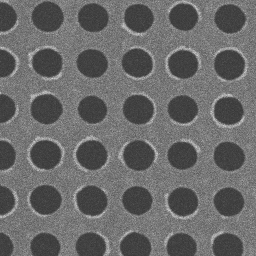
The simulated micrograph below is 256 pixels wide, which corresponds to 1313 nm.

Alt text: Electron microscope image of a regular array of holes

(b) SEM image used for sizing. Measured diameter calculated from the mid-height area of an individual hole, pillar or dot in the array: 152 nanometres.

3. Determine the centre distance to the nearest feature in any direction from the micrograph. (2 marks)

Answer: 232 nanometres